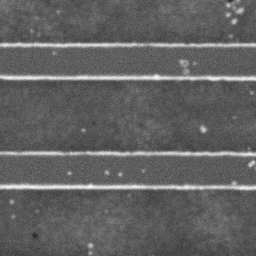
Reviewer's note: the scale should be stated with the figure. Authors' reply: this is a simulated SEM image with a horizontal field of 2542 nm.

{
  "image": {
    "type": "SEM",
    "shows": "lines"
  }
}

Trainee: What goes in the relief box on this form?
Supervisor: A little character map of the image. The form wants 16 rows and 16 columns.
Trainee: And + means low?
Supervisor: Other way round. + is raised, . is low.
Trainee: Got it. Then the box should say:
................
................
................
++++++++++++++++
++++++++++++++++
................
................
................
................
................
++++++++++++++++
++++++++++++++++
................
................
................
................